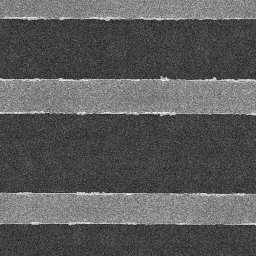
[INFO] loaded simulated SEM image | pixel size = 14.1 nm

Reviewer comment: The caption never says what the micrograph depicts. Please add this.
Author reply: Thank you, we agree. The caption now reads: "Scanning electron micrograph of one or a few lines or trenches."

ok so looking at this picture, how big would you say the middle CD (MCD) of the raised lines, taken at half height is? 438 nanometers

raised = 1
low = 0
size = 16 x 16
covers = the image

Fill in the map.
1111111111111111
0000000000000000
0000000000000000
0000000000000000
0000000000000000
1111111111111111
1111111111111111
0000000000000000
0000000000000000
0000000000000000
0000000000000000
0000000000000000
1111111111111111
1111111111111111
0000000000000000
0000000000000000